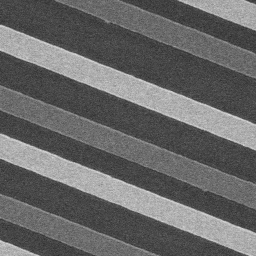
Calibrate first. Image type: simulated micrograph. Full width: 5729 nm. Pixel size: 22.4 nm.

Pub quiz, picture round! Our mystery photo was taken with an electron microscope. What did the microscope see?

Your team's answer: lines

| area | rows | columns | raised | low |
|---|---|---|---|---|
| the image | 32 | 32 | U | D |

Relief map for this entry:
DDDDDDDDUUUUUUUUDDDDDDDUUUUUUUUU
DDDDDDDDDDDUUUUUUUDDDDDDDDUUUUUU
DDDDDDDDDDDDDUUUUUUUUDDDDDDDUUUU
UDDDDDDDDDDDDDDDUUUUUUUUDDDDDDDU
UUUUDDDDDDDDDDDDDDUUUUUUUUDDDDDD
UUUUUUDDDDDDDDDDDDDDDUUUUUUUUDDD
UUUUUUUUUDDDDDDDDDDDDDDUUUUUUUUD
DDDUUUUUUUUDDDDDDDDDDDDDDDUUUUUU
DDDDDDUUUUUUUUDDDDDDDDDDDDDDDUUU
DDDDDDDDUUUUUUUUDDDDDDDDDDDDDDDU
DDDDDDDDDDDUUUUUUUUDDDDDDDDDDDDD
UUDDDDDDDDDDDUUUUUUUUUDDDDDDDDDD
UUUUUDDDDDDDDDDDUUUUUUUUDDDDDDDD
UUUUUUUDDDDDDDDDDDUUUUUUUUUDDDDD
DDUUUUUUUUDDDDDDDDDDDUUUUUUUUDDD
DDDDDUUUUUUUDDDDDDDDDDDDUUUUUUUU
DDDDDDDUUUUUUUUDDDDDDDDDDDUUUUUU
UUDDDDDDDDUUUUUUUDDDDDDDDDDDDUUU
UUUUDDDDDDDDUUUUUUUUDDDDDDDDDDDU
UUUUUUUDDDDDDDDUUUUUUUUDDDDDDDDD
DDUUUUUUUUDDDDDDDUUUUUUUUDDDDDDD
DDDDUUUUUUUUDDDDDDDDUUUUUUUUDDDD
DDDDDDDUUUUUUUUDDDDDDDUUUUUUUUDD
DDDDDDDDDDUUUUUUUDDDDDDDDUUUUUUU
UDDDDDDDDDDDUUUUUUUUDDDDDDDDUUUU
UUUDDDDDDDDDDDDUUUUUUUDDDDDDDDUU
UUUUUUDDDDDDDDDDDUUUUUUUUDDDDDDD
DUUUUUUUDDDDDDDDDDDDUUUUUUUUDDDD
DDDUUUUUUUUDDDDDDDDDDDUUUUUUUUDD
DDDDDDUUUUUUUDDDDDDDDDDDDUUUUUUU
UDDDDDDDUUUUUUUUDDDDDDDDDDDUUUUU
UUUUDDDDDDDUUUUUUUUDDDDDDDDDDDUU